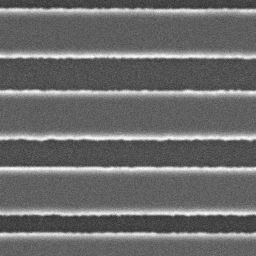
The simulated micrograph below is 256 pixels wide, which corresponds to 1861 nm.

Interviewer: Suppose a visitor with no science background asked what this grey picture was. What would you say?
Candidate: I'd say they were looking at lines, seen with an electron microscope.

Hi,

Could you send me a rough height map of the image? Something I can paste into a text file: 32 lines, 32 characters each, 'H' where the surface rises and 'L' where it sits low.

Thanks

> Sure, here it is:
LLLLLLLLLLLLLLLLLLLLLLLLLLLLLLLL
HHHHHHHHHHHHHHHHHHHHHHHHHHHHHHHH
HHHHHHHHHHHHHHHHHHHHHHHHHHHHHHHH
HHHHHHHHHHHHHHHHHHHHHHHHHHHHHHHH
HHHHHHHHHHHHHHHHHHHHHHHHHHHHHHHH
HHHHHHHHHHHHHHHHHHHHHHHHHHHHHHHH
HHHHHHHHHHHHHHHHHHHHHHHHHHHHHHHH
LLLLLLLLLLLLLLLLLLLLLLLLLLLLLLLL
LLLLLLLLLLLLLLLLLLLLLLLLLLLLLLLL
LLLLLLLLLLLLLLLLLLLLLLLLLLLLLLLL
LLLLLLLLLLLLLLLLLLLLLLLLLLLLLLLL
HHHHHHHHHHHHHHHHHHHHHHHHHHHHHHHH
HHHHHHHHHHHHHHHHHHHHHHHHHHHHHHHH
HHHHHHHHHHHHHHHHHHHHHHHHHHHHHHHH
HHHHHHHHHHHHHHHHHHHHHHHHHHHHHHHH
HHHHHHHHHHHHHHHHHHHHHHHHHHHHHHHH
HHHHHHHHHHHHHHHHHHHHHHHHHHHHHHHH
LLLLLLLLLLLLLLLLLLLLLLLLLLLLLLLL
LLLLLLLLLLLLLLLLLLLLLLLLLLLLLLLL
LLLLLLLLLLLLLLLLLLLLLLLLLLLLLLLL
LLLLLLLLLLLLLLLLLLLLLLLLLLLLLLLL
HHHHHHHHHHHHHHHHHHHHHHHHHHHHHHHH
HHHHHHHHHHHHHHHHHHHHHHHHHHHHHHHH
HHHHHHHHHHHHHHHHHHHHHHHHHHHHHHHH
HHHHHHHHHHHHHHHHHHHHHHHHHHHHHHHH
HHHHHHHHHHHHHHHHHHHHHHHHHHHHHHHH
HHHHHHHHHHHHHHHHHHHHHHHHHHHHHHHH
LLLLLLLLLLLLLLLLLLLLLLLLLLLLLLLL
LLLLLLLLLLLLLLLLLLLLLLLLLLLLLLLL
HHHHHHHHHHHHHHHHHHHHHHHHHHHHHHHH
HHHHHHHHHHHHHHHHHHHHHHHHHHHHHHHH
HHHHHHHHHHHHHHHHHHHHHHHHHHHHHHHH